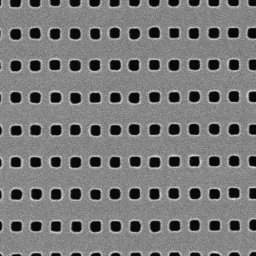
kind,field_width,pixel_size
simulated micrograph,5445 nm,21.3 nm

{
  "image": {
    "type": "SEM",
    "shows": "a regular array of holes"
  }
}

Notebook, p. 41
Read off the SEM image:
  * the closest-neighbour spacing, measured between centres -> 413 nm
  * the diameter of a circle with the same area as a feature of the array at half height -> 251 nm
